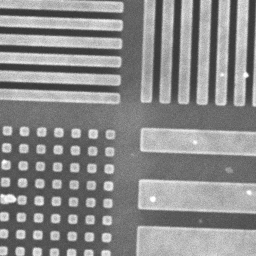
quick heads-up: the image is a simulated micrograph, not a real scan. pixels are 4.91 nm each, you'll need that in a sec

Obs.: groups of lines, slits or small figures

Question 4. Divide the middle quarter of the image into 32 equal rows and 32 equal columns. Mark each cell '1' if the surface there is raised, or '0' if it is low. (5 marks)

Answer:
00000000111111000000110011100110
00000000000000000000110011100110
11111000000000000000110011100110
11111111111111000000110011100110
11111111111111000000110011100110
00000000000000000000110011100110
00000000000000000001110011100110
11111111111111000001110011100110
11111111111111000001110011000110
00000001111111000000000011000110
00000000000000000000000000000000
00000000000000000000000000000000
00000000000000000000000000000000
00000000000000000000000000000000
00000000000000000000000000000000
00000000000000000000000000000000
00110000000000000001111111110000
00110011000100000001111111111111
00000000000100000001111111111111
00000000000000000001111111111111
00000000000000000001111111111111
00110011001100000001111111111111
00110011001100000000000000000000
00000000000000000000000000000000
00000000000000000000000000000000
00110011001100000000000000000000
00110011001100000000000000000000
00000000000000000000000000000000
00000000000000000000000000000000
00100010000000000001111111111100
00100011001100000001111111111111
00000000001100000001111111111111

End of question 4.